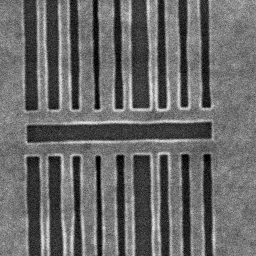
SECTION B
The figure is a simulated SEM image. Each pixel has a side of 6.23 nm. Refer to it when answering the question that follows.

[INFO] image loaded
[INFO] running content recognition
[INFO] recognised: groups of lines, slits or small figures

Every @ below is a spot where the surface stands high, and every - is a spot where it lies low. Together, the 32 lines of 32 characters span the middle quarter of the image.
@---@@@--@@@@--@@----@@---@@@--@
@---@@@--@@@@--@@----@@---@@@--@
@---@@@--@@@@--@@----@@---@@@--@
@@--@@@--@@@@--@@-----@---@@@--@
@@--@@@--@@@@--@@-----@---@@@--@
@@--@@@--@@@---@@-----@---@@@--@
@@--@@@--@@@---@@-----@---@@@--@
@@--@@@--@@@---@@-----@---@@@--@
@@--@@@--@@@---@@-----@---@@@--@
@@--@@@--@@@---@@-----@---@@@--@
@@--@@@--@@@---@@-----@---@@@--@
@@--@@@@-@@@@-@@@@@@@@@@@@@@@@@@
@@@@@@@@@@@@@@@@@@@@@@@@@@@@@@@@
@@@@@@@@@@@@@@@@@@@@@@@@@@@@@@@@
@@@@@@@@@@@-----@@@@@@@---------
--------------------------------
--------------------------------
--------------------------------
--------------------------------
---------------@@@@@@@@@@@@@@@@@
@@@@@@@@@@@@@@@@@@@@@@@@@@@@@@@@
@@@@@@@@@@@@@@@@@@@@@@@@@@@@@@@@
@@@@@@@@@@@@@--@@@---@@@--@@@--@
@@--@@@@-@@@@--@@-----@@--@@@---
@@--@@@@-@@@@--@@-----@@--@@@---
@@--@@@@-@@@@--@@-----@@--@@@---
@@--@@@@-@@@@--@@-----@@--@@@---
@@--@@@@-@@@@--@@-----@@--@@@---
@@--@@@@-@@@@--@@-----@@--@@@---
@@--@@@@-@@@@--@@-----@@--@@@---
@@--@@@@-@@@@--@@-----@@--@@@---
@@--@@@@-@@@@--@@-----@@--@@@---